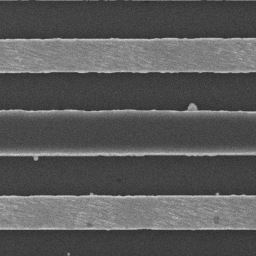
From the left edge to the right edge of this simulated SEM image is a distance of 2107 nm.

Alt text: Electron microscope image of lines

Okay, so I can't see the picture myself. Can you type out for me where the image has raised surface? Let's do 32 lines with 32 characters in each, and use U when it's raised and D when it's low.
DDDDDDDDDDDDDDDDDDDDDDDDDDDDDDDD
DDDDDDDDDDDDDDDDDDDDDDDDDDDDDDDD
DDDDDDDDDDDDDDDDDDDDDDDDDDDDDDDD
DDDDDDDDDDDDDDDDDDDDDDDDDDDDDDDD
DDDDDDDDDDDDDDDDDDDDDDDDDDDDDDDD
UUUUUUUUUUUUUUUUUUUUUUUUUUUUUUUU
UUUUUUUUUUUUUUUUUUUUUUUUUUUUUUUU
UUUUUUUUUUUUUUUUUUUUUUUUUUUUUUUU
UUUUUUUUUUUUUUUUUUUUUUUUUUUUUUUU
DDDDDDDDDDDDDDDDDDDDDDDDDDDDDDDD
DDDDDDDDDDDDDDDDDDDDDDDDDDDDDDDD
DDDDDDDDDDDDDDDDDDDDDDDDDDDDDDDD
DDDDDDDDDDDDDDDDDDDDDDDDDDDDDDDD
DDDDDDDDDDDDDDDDDDDDDDDDDDDDDDDD
UUUUUUUUUUUUUUUUUUUUUUUUUUUUUUUU
UUUUUUUUUUUUUUUUUUUUUUUUUUUUUUUU
UUUUUUUUUUUUUUUUUUUUUUUUUUUUUUUU
UUUUUUUUUUUUUUUUUUUUUUUUUUUUUUUU
UUUUUUUUUUUUUUUUUUUUUUUUUUUUUUUU
DDDDDDDDDDDDDDDDDDDDDDDDDDDDDDDD
DDDDDDDDDDDDDDDDDDDDDDDDDDDDDDDD
DDDDDDDDDDDDDDDDDDDDDDDDDDDDDDDD
DDDDDDDDDDDDDDDDDDDDDDDDDDDDDDDD
DDDDDDDDDDDDDDDDDDDDDDDDDDDDDDDD
DDDDDDDDDDDDDDDDDDDDDDDDDDDDDUUD
UUUUUUUUUUUUUUUUUUUUUUUUUUUUUUUU
UUUUUUUUUUUUUUUUUUUUUUUUUUUUUUUU
UUUUUUUUUUUUUUUUUUUUUUUUUUUUUUUU
UUUUUUUUUUUUUUUUUUUUUUUUUUUUUUUU
DDDDDDDDDDDDDDDDDDDDDDDDDDDDDDDD
DDDDDDDDDDDDDDDDDDDDDDDDDDDDDDDD
DDDDDDDDDDDDDDDDDDDDDDDDDDDDDDDD